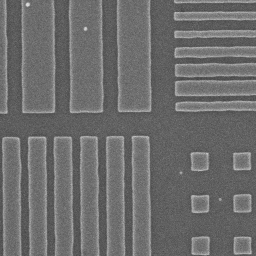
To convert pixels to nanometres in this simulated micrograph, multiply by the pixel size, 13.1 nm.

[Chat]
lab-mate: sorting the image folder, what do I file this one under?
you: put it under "groups of lines, slits or small figures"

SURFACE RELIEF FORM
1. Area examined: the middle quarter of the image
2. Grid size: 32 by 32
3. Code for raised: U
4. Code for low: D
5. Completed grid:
DDUUUUUUUUDDDDUUUUUUUDDDDDDDUUUU
DDUUUUUUUUDDDDUUUUUUUDDDDDDDUUUU
DDUUUUUUUUDDDDUUUUUUUUDDDDDDUUUU
DDUUUUUUUUDDDDUUUUUUUDDDDDDDDDDD
DDUUUUUUUDDDDDUUUUUUUDDDDDDDUUUU
DDUUUUUUUUDDDDUUUUUUUUDDDDDDUUUU
DDUUUUUUUUDDDDUUUUUUUUDDDDDDUUUU
DDUUUUUUUUDDDDUUUUUUUUDDDDDDUUUU
DDUUUUUUUUDDDDUUUUUUUUDDDDDDDDDD
DDUUUUUUUUDDDDUUUUUUUUDDDDDDDDDD
DDUUUUUUUDDDDDUUUUUUUUDDDDDDUUUU
DDUUUUUUUUDDDDUUUUUUUUDDDDDDUUUU
DDDDDDDDDDDDDDDDDDDDDDDDDDDDDDDD
DDDDDDDDDDDDDDDDDDDDDDDDDDDDDDDD
DDDDDDDDDDDDDDDDDDDDDDDDDDDDDDDD
DDDDDDDDDDDDDDDDDDDDDDDDDDDDDDDD
DDDDDDDDDDDDDDDDDDDDDDDDDDDDDDDD
DDDDDDDDDDDDDDDDDDDDDDDDDDDDDDDD
UUDDUUUUDDDUUUUDDUUUUDDDDDDDDDDD
UUDDUUUUDDDUUUUDDUUUUDDDDDDDDDDD
UUDDUUUUDDDUUUUDDUUUUDDDDDDDDDDD
UUDDUUUUDDDUUUUDDUUUUDDDDDDDDDDD
UUDDUUUUDDDUUUUDDUUUUDDDDDDDDDDD
UUDDUUUUDDDUUUUDDUUUUDDDDDDDDDDD
UUDDUUUUDDDUUUUDDUUUUDDDDDDDDDDD
UUDDUUUUDDDUUUUDDUUUUDDDDDDDDDDD
UUDDUUUUDDDUUUUDDUUUUDDDDDDDDDDD
UUDDUUUUDDDUUUUDDUUUUDDDDDDDDDDD
UUDDUUUUUDDUUUUDDUUUUDDDDDDDDDDD
UUDDUUUUUDDUUUUDDUUUUDDDDDDDDDDD
UUDDUUUUUDDUUUUDDUUUUDDDDDDDDDDD
UUDDUUUUUDDUUUUDDUUUUDDDDDDDDDDD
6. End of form